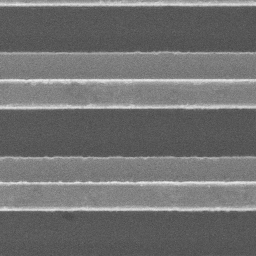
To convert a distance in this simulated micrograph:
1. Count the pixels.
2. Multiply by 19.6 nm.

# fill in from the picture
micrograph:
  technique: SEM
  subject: lines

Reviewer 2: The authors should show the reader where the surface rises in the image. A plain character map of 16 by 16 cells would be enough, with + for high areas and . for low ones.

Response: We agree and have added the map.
................
................
................
++++++++++++++++
++++++++++++++++
++++++++++++++++
++++++++++++++++
................
................
................
++++++++++++++++
++++++++++++++++
++++++++++++++++
................
................
................